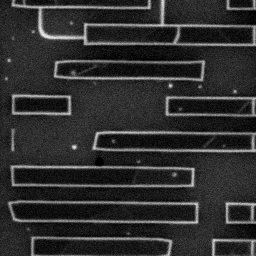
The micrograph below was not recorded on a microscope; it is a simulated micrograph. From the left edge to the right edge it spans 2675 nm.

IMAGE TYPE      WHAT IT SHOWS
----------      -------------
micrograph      wiring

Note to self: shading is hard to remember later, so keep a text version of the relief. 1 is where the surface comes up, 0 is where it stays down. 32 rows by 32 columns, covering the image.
00111111111111111111000000000111
00000111111111111111000000000000
00000111111111111111000000000000
00000111111111111111111111111111
00000011111111111111111111111111
00000000000000000000000001111111
00000000000000000000000000000000
00000000000000000000000000000000
00000001111111111111111110000000
00000001111111111111111110000000
00000000000000000000000000000000
00000000000000000000000000000000
00111111100000000000011111111111
00111111100000000000011111111111
00000000000000000000000000000000
00000000000000000000000000000000
00000000000000000000000000000000
00000000000011111111111111111111
00000000000011111111111111111111
00000000000000000000000000000000
00000000000000000000000000000000
00111111111111111111111100000000
00111111111111111111111100000000
00000000000000000000000000000000
00000000000000000000000000000000
01111111111111111111111000000000
00111111111111111111111110001111
00111111111111111111111100001111
00000000000000000000000000000000
00000000000000000000000000000000
00001111111111111111100000011111
00001111111111111111100000011111